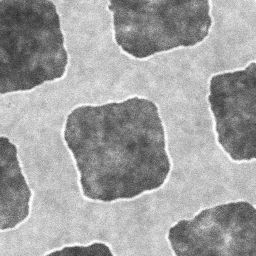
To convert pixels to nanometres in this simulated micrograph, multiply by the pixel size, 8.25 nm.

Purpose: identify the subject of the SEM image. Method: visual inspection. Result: holes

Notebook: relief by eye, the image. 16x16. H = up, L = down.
LLLHHHHLLLLLLHHH
LLLLHHHLLLLLLHHH
LLLLHHHLLLLLLHHH
LLLLHHHHLHHHHHHH
LLLLHHHHHHHHHHLL
LLHHHHHHHHHHHLLL
HHHHHHHLLLHHHLLL
HHHHLLLLLLHHHLLL
HHHHLLLLLLHHHHLL
LHHHLLLLLLHHHHLL
LHHHHLLLLLLHHHHH
LLHHHLLLLLHHHHHH
LLHHHHLHHHHHHHHH
LLHHHHHHHHHHLLLL
HHHHHHHHHHHLLLLL
HHHHLLLHHHHLLLLL